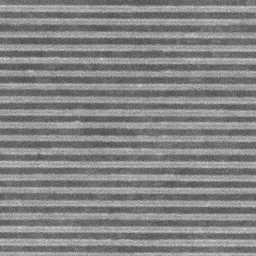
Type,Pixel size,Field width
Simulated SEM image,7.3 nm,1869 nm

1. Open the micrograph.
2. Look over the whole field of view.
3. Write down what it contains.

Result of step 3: parallel lines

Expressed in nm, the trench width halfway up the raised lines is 63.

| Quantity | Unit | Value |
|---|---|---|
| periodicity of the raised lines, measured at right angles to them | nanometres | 94.8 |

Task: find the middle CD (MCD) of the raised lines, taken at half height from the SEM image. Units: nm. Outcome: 35.6